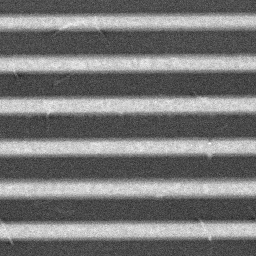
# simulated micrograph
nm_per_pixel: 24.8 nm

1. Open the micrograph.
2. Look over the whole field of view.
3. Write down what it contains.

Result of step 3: parallel lines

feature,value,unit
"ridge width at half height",351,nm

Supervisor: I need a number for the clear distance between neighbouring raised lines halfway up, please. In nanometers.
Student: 674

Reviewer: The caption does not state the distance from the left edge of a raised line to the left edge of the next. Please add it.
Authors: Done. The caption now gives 1040 nm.